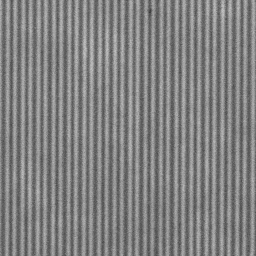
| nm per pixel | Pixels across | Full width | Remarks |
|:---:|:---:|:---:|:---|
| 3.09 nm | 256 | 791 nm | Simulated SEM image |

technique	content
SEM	parallel lines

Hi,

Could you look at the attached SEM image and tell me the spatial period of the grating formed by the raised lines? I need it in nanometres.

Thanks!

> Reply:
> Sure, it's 23.7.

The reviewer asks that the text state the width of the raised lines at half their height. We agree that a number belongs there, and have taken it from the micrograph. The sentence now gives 8.9 nm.